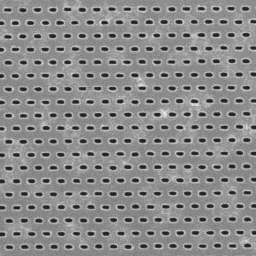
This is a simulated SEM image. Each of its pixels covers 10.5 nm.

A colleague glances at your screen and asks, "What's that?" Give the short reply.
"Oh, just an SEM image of a regular array of holes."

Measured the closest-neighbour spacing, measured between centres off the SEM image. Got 153 nm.